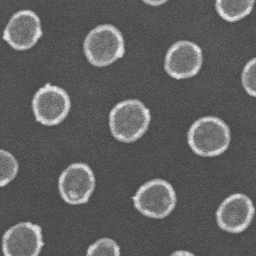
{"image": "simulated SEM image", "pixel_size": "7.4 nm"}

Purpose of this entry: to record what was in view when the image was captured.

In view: a regular array of raised bodies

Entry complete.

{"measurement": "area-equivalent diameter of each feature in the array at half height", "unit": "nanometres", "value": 278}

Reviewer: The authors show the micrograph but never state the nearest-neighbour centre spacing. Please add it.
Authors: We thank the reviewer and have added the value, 592 nanometers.